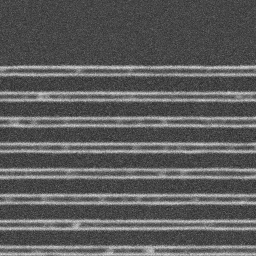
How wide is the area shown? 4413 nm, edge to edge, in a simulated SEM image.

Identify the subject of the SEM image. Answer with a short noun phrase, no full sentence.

parallel lines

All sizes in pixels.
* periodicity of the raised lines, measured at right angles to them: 25.7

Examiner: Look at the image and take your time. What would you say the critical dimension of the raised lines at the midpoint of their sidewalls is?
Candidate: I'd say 144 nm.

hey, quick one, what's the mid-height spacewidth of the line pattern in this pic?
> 306 nanometres